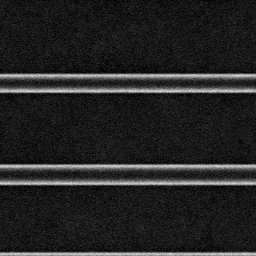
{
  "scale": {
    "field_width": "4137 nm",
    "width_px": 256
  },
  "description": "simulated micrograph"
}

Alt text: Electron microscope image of lines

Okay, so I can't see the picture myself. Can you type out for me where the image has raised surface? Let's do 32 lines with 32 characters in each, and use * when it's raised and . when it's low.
................................
................................
................................
................................
................................
................................
................................
................................
................................
********************************
********************************
................................
................................
................................
................................
................................
................................
................................
................................
................................
................................
********************************
********************************
................................
................................
................................
................................
................................
................................
................................
................................
................................